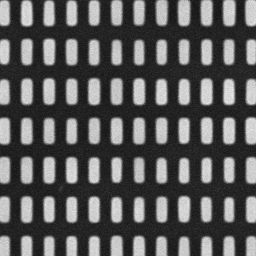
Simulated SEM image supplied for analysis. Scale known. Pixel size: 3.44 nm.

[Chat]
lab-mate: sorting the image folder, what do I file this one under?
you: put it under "groups of lines, slits or small figures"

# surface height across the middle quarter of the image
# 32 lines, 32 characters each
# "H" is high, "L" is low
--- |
LLLLLLLLLLLLLLLLLLLLLLLLLLLLLLLL
LLLLLLLLLLLLLLLLLLLLLLLLLLLLLLLL
LLLLLLLLLLLLLLLLLLLLLLLLLLLLLLLL
LLLLLLLLLLLLLLLLLLLLLLLLLLLLLLLL
LHHLLLHHHLLLHHLLLHHHLLLHHLLLLHHL
LHHLLLHHHLLLHHLLLHHHLLLHHLLLLHHL
LHHLLLHHHLLLHHLLLHHHLLLHHLLLLHHL
LHHLLLHHHLLLHHLLLHHHLLLHHHLLLHHL
LHHLLLHHHLLLHHLLLHHHLLLHHHLLLHHL
LHHLLLHHHLLLHHLLLLHHLLLHHLLLLHHL
LLLLLLLLLLLLLLLLLLLLLLLLLLLLLLLL
LLLLLLLLLLLLLLLLLLLLLLLLLLLLLLLL
LLLLLLLLLLLLLLLLLLLLLLLLLLLLLLLL
LLLLLLLLLLLLLLLLLLLLLLLLLLLLLLLL
LHHLLLHHHLLLHHLLLHHHLLLHHHLLLHHL
LHHLLLHHHLLLHHLLLHHHLLLHHHLLLHHL
LHHLLLHHHLLLHHLLLHHHLLLHHHLLLHHL
LHHLLLHHHLLLHHLLLHHHLLLHHHLLLHHL
LHHLLLHHHLLLHHLLLHHHLLLHHHLLLHHL
LHHLLLLHLLLLHHLLLLHHLLLLHLLLLHHL
LLLLLLLLLLLLLLLLLLLLLLLLLLLLLLLL
LLLLLLLLLLLLLLLLLLLLLLLLLLLLLLLL
LLLLLLLLLLLLLLLLLLLLLLLLLLLLLLLL
LHLLLLLLLLLLLLLLLLLLLLLLLLLLLLLL
LHHLLLHHHLLLHHLLLLHHLLLHHLLLLHHL
LHHLLLHHHLLLHHLLLLHHLLLHHLLLLHHL
LHHLLLHHHLLLHHLLLLHHLLLHHLLLLHHL
LHHLLLHHHLLLHHLLLLHHLLLHHLLLLHHL
LHHLLLHHHLLLHHLLLLHHLLLHHLLLLHHL
LHHLLLLHLLLLLLLLLLLLLLLLHLLLLHHL
LLLLLLLLLLLLLLLLLLLLLLLLLLLLLLLL
LLLLLLLLLLLLLLLLLLLLLLLLLLLLLLLL